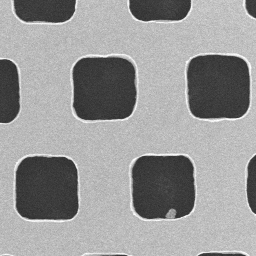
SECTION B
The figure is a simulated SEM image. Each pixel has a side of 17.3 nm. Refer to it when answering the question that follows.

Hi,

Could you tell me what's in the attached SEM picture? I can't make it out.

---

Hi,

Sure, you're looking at holes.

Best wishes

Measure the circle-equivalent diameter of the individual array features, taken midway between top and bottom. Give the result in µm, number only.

1.2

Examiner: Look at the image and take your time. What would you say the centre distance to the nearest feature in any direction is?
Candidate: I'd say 1970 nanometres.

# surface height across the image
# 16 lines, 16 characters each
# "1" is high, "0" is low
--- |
1000011100001110
1111111111111111
1111111111111111
1111111111110011
0111100001110000
0111100001110000
0111100011110000
0111110111111111
1111111111111111
1111111111111111
1000011100001110
1000011100001110
1000011100001110
1000011110011111
1111111111111111
1111111111111111